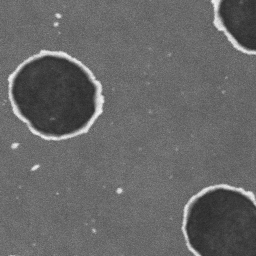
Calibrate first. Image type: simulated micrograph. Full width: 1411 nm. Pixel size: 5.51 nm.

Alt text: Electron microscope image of holes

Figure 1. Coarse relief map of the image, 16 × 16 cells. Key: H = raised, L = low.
HHHHHHHHHHHHHHLL
HHHHHHHHHHHHHHLL
HHHHHHHHHHHHHHHL
HHHHHHHHHHHHHHHH
HLLLLHHHHHHHHHHH
HLLLLLHHHHHHHHHH
HLLLLLHHHHHHHHHH
HHLLLLHHHHHHHHHH
HHHHHHHHHHHHHHHH
HHHHHHHHHHHHHHHH
HHHHHHHHHHHHHHHH
HHHHHHHHHHHHHHHH
HHHHHHHHHHHHLLLL
HHHHHHHHHHHHLLLL
HHHHHHHHHHHHLLLL
HHHHHHHHHHHHLLLL